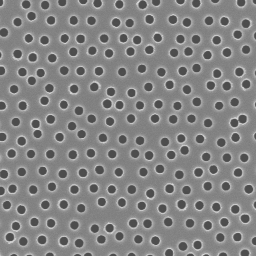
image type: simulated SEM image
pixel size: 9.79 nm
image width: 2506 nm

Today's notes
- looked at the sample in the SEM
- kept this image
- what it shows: a regular array of holes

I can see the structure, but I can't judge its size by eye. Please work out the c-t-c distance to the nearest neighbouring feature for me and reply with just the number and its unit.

152 nanometers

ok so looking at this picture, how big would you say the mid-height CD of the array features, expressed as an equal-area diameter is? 0.0811 µm